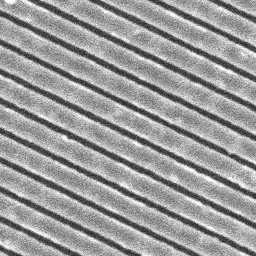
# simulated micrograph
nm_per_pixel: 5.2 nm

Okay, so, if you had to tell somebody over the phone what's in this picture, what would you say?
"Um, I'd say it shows parallel lines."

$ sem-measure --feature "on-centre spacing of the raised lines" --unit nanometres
137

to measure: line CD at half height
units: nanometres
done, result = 103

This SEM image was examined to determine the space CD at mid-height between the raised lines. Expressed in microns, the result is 0.0345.